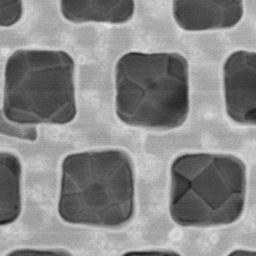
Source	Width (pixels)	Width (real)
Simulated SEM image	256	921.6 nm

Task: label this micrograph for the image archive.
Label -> holes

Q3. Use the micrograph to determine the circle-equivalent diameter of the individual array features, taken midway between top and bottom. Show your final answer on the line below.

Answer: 0.29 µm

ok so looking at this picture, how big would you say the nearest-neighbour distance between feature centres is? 401 nm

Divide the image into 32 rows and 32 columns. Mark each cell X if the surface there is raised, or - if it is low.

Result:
---XXXXX---------XXXXX--------XX
---XXXXX---------XXXXX--------XX
--XXXXXX--------XXXXXX--------XX
XXXXXXXXXXXXXXXXXXXXXXX----XXXXX
XXXXXXXXXXXXXXXXXXXXXXXXXXXXXXXX
XXXXXXXXXXXXXXXXXXXXXXXXXXXXXXXX
XX------XXXXXXXXXXXXXXXXXXXXXX--
X--------XXXXXX--------XXXXX----
X--------XXXXXX---------XXXX----
X--------XXXXX----------XXXX----
X--------XXXXXX---------XXXX----
---------XXXXXX--------XXXXX----
---------XXXXXX---------XXXX----
---------XXXXX----------XXXX----
X--------XXXXXX--------XXXXXX---
XX--XXXXXXXXXXXX-------XXXXXXXX-
XXXXXXXXXXXXXXXXXXXXXXXXXXXXXXXX
XXXXXXXXXXXXXXXXXXXXXXXXXXXXXXXX
XXXXXXXXXXXXXXXXXXXXXXXXXXXXXXXX
--XXXXXXX-------XXXXXXX------XXX
---XXXXX---------XXXXX--------XX
---XXXXX---------XXXX----------X
---XXXXX---------XXXX----------X
---XXXXX---------XXXX----------X
---XXXXX---------XXXX----------X
---XXXX----------XXXX----------X
---XXXX----------XXXX---------XX
--XXXXXX--------XXXXXX--------XX
XXXXXXXXXXXX---XXXXXXXXXXXXXXXXX
XXXXXXXXXXXXXXXXXXXXXXXXXXXXXXXX
XXXXXXXXXXXXXXXXXXXXXXXXXXXXXXXX
XX-------XXXXXXX------XXXXXXX---